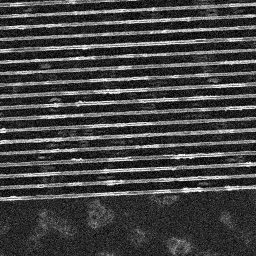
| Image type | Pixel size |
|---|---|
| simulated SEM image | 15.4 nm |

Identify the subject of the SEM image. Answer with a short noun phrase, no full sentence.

parallel lines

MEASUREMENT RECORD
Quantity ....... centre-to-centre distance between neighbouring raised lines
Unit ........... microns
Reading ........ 0.176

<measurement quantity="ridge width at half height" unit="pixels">2.99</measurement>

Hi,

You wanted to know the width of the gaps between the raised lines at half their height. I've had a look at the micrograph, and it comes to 123 nanometres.